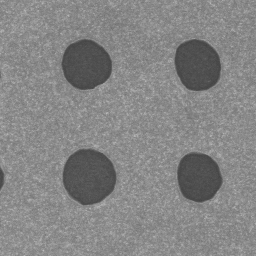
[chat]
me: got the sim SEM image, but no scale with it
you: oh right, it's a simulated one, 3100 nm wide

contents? holes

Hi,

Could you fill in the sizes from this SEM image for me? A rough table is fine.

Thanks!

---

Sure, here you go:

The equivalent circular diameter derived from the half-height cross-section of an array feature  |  0.605 micrometres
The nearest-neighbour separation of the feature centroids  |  110 px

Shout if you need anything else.